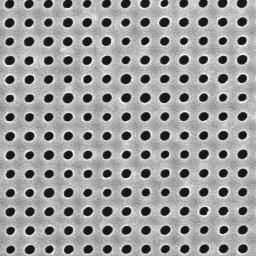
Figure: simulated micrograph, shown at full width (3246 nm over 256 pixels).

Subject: a regular array of holes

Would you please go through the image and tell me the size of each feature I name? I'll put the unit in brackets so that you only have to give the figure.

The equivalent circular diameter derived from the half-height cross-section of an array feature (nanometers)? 120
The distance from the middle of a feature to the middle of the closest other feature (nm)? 238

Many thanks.